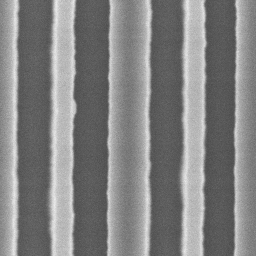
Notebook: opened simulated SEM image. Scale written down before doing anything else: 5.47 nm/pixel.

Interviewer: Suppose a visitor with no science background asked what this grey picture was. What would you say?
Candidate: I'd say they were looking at lines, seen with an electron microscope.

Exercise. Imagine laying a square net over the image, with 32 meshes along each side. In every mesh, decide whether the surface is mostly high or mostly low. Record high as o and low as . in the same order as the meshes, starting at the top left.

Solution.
oo.....oo.....ooooo....oo.....oo
oo.....oo.....ooooo....ooo....oo
oo.....oo.....ooooo....ooo....oo
oo.....oo.....ooooo....ooo....oo
oo.....oo.....ooooo....ooo....oo
oo.....oo.....ooooo....ooo....oo
oo.....oo.....ooooo....ooo....oo
oo.....oo.....oooo.....ooo....oo
oo.....oo.....ooooo....ooo....oo
oo.....oo.....ooooo....ooo...ooo
oo.....oo.....ooooo....ooo....oo
oo.....oo.....ooooo....oo.....oo
oo.....oo.....oooo.....oo.....oo
oo.....ooo....oooo.....oo.....oo
oo.....oo.....oooo.....ooo....oo
oo.....oo.....oooo.....ooo...ooo
oo.....oo.....oooo.....oo....ooo
oo.....oo....oooooo....oo....ooo
oo.....oo.....ooooo....oo....ooo
oo.....oo.....oooo.....oo....ooo
oo.....oo.....ooooo....oo....ooo
oo.....oo.....oooo.....oo....ooo
oo.....oo.....oooo.....oo....ooo
oo.....oo....ooooo.....oo....ooo
oo.....oo....oooooo....oo....ooo
oo.....oo.....ooooo....oo....ooo
oo.....oo....ooooo.....oo....ooo
oo.....oo....ooooo.....oo....ooo
oo.....oo.....oooo.....oo....ooo
oo.....oo.....oooo.....oo....ooo
oo.....oo....ooooo.....oo....ooo
oo.....oo....ooooo.....oo....ooo